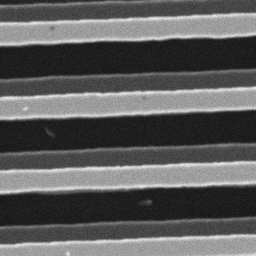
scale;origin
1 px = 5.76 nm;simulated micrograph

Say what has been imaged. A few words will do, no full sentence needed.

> lines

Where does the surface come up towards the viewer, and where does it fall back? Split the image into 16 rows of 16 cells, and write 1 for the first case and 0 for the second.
1111111111111111
1111111111111111
1111111111000000
0000000000000000
0000000000000111
1111111111111111
1111111111111111
0000000000000000
0000000000000000
0011111111111111
1111111111111111
1111111111111111
0000000000000000
0000000000000000
1111111111111111
1111111111111111